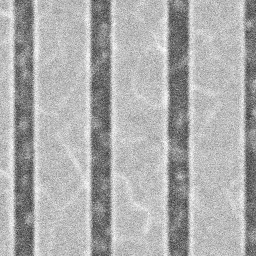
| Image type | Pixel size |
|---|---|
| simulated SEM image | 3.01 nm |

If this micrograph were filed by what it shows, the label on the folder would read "one or a few lines or trenches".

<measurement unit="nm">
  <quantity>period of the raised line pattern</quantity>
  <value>232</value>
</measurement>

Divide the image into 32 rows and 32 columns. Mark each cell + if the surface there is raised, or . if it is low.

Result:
+...+++++++...+++++++...++++++..
++..+++++++...+++++++...++++++..
++..+++++++...+++++++...++++++..
++..+++++++...+++++++...++++++..
++..+++++++...+++++++...++++++..
++..+++++++...+++++++...++++++..
++..+++++++...+++++++...++++++..
++..+++++++...+++++++...++++++..
++..+++++++...+++++++...++++++..
++..+++++++...+++++++...++++++..
++..+++++++...+++++++...++++++..
++..+++++++...+++++++...++++++..
++..+++++++...+++++++...++++++..
++..+++++++...+++++++...++++++..
++..+++++++...+++++++...++++++..
++..+++++++...+++++++...++++++..
++..+++++++...+++++++...++++++..
++..+++++++...+++++++...++++++..
++..+++++++...+++++++...++++++..
++..+++++++...+++++++...++++++..
++..+++++++...+++++++...++++++..
++..+++++++...+++++++...++++++..
++..+++++++...+++++++...++++++..
++..+++++++...+++++++...++++++..
++..+++++++...+++++++...++++++..
++..+++++++...+++++++...++++++..
++...++++++...+++++++...++++++..
++...++++++...+++++++...++++++..
++...++++++...+++++++...++++++..
++...++++++...+++++++...++++++..
++...++++++...+++++++...++++++..
++...++++++...+++++++...++++++..